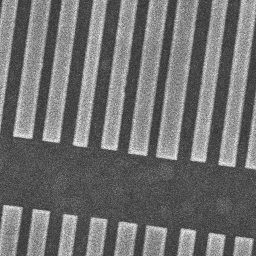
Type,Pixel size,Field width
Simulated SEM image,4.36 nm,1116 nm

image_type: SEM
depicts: parallel lines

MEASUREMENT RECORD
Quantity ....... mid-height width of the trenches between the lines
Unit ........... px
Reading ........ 14.5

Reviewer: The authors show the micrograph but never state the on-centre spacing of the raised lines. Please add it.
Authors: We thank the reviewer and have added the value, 128 nanometers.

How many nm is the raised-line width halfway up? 67.5